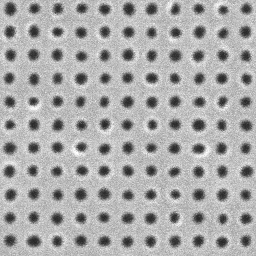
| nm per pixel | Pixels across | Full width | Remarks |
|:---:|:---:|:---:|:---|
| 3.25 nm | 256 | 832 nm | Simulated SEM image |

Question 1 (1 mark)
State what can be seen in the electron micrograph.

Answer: a regular array of holes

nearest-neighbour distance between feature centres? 74.2 nanometres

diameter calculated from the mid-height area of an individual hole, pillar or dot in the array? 40.2 nm